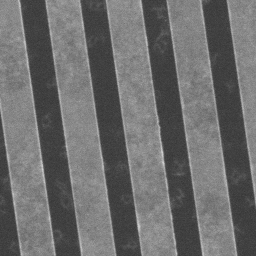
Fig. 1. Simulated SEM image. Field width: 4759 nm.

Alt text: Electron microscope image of parallel lines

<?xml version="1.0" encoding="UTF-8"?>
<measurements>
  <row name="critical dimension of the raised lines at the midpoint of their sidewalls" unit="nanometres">626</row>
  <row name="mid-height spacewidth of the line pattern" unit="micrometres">0.481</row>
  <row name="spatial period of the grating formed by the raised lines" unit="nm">1120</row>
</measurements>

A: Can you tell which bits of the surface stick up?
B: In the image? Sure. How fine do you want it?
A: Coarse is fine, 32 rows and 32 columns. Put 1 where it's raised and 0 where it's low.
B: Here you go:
11000011110001111100011110001111
11100011110001111100011110000011
11100011110000111100011110000111
11100011110000111100011111000111
11100011111000111100011111000111
11100011111000111100001111000111
11100001111000111110001111000111
11100001111000111110001111000111
11110001111000111110001111000011
11110001111000011110001111000011
11110001111000011110001111100011
11110001111100011110000111100011
11110001111100011110000111100011
11110000111100011111000111100011
11110000111100011111000111100011
11111000111100011111000111100001
11111000111100001111000111100001
01111000111100001111000111110001
01111000111110001111000111110001
01111000111110001111000011110001
01111000011110001111100011110001
01111000011110001111100011110001
01111100011110001111100011110000
01111100011110000111100011110000
00111100011110000111100011111000
00111100111111000111100011111000
00111100011111000111100001111000
00111100001111000011100001111000
00111100001111000011110001111000
00111110001111000111110001111000
00111110001111000011110001111000
00011110001111000011110001111100